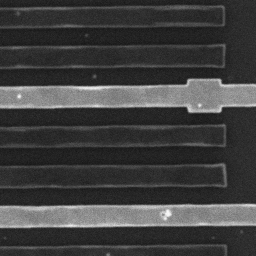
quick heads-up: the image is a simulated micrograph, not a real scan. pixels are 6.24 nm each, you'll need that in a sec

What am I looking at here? wiring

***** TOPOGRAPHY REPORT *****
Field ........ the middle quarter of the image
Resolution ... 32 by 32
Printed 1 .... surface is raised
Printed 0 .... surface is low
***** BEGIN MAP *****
11111111111111111111111111111111
00000000000000000000000000000000
00000000000000000000000000000000
00000000000000000000000000000000
00000000000000000000000000000001
00000000000000000000000111111111
11111111111111111111111111111111
11111111111111111111111111111111
11111111111111111111111111111111
11111111111111111111111111111111
11111111111111111111111111111111
00000000000000000000000000000001
00000000000000000000000000000000
00000000000000000000000000000000
00000000000000000000000000000000
00000000000000000000000000000000
11111111111111111111111111111111
11111111111111111111111111111111
11111111111111111111111111111111
11111111111111111111111111111111
11000000000000000000000000000000
00000000000000000000000000000000
00000000000000000000000000000000
00000000000000000000000000000000
00000000000000000000000000000000
11111111111111111111111111111111
11111111111111111111111111111111
11111111111111111111111111111111
11111111111111111111111111111111
11111111111111111111111111111111
11111111111111110001111000000011
00000000000000000000000000000000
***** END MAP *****